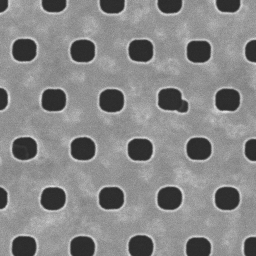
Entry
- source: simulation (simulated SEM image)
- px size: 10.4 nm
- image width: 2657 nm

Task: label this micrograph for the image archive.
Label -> a regular array of holes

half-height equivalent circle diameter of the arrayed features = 263 nanometres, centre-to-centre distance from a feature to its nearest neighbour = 0.585 µm